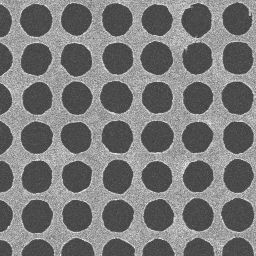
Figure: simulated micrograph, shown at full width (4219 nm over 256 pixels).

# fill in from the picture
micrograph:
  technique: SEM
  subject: a regular array of holes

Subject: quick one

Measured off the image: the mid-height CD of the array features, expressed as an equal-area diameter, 0.526 µm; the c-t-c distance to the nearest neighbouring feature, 0.642 micrometres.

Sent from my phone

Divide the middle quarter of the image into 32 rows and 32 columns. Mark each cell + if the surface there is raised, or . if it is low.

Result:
.......+++.......+++.......+++..
......+++++.....++++......+++++.
+....+++++++..++++++++..++++++++
++++++++++++++++++++++++++++++++
++..+++++++...++++++++..++++++++
+.....++++......++++......+++++.
......+++.......++++.......+++..
.......++........+++.......+++..
.......++........++........+++..
.......++........++........+++..
.......+++.......+++.......+++..
+.....+++++.....+++++.....+++++.
++...++++++++.++++++++++++++++++
++++++++++++++++++++++++++++++++
++..+++++++....+++++++...+++++++
......++++......++++......+++++.
.......+++.......+++.......+++..
.......++........++........+++..
.......++........++........++...
.......+++.......++........+++..
.......+++.......+++.......+++..
+.....+++++.....+++++.....+++++.
+++++++++++++..+++++++++++++++++
++++++++++++++++++++++++++++++++
++...+++++++....++++++..++++++++
......+++++......++++.....+++++.
.......+++.......+++.......+++..
.......+++.......++........+++..
.......+++.......++........+++..
.......+++.......+++.......+++..
......++++.......+++.......+++..
+....++++++.....+++++.....+++++.